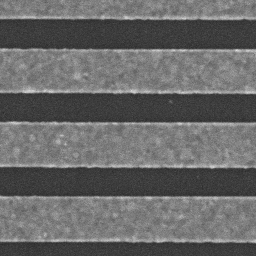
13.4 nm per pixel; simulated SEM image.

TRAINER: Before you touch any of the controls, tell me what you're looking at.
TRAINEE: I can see lines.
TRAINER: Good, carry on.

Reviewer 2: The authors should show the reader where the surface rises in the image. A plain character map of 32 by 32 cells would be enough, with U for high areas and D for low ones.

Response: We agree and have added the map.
UUUUUUUUUUUUUUUUUUUUUUUUUUUUUUUU
UUUUUUUUUUUUUUUUUUUUUUUUUUUUUUUU
DDDDDDDDDDDDDDDDDDDDDDDDDDDDDDDD
DDDDDDDDDDDDDDDDDDDDDDDDDDDDDDDD
DDDDDDDDDDDDDDDDDDDDDDDDDDDDDDDD
DDDDDDDDDDDDDDDDDDDDDDDDDDDDDDDD
UUUUUUUUUUUUUUUUUUUUUUUUUUUUUUUU
UUUUUUUUUUUUUUUUUUUUUUUUUUUUUUUU
UUUUUUUUUUUUUUUUUUUUUUUUUUUUUUUU
UUUUUUUUUUUUUUUUUUUUUUUUUUUUUUUU
UUUUUUUUUUUUUUUUUUUUUUUUUUUUUUUU
UUUUUUUUUUUUUUUUUUUUUUUUUUUUUUUU
DDDDDDDDDDDDDDDDDDDDDDDDDDDDDDDD
DDDDDDDDDDDDDDDDDDDDDDDDDDDDDDDD
DDDDDDDDDDDDDDDDDDDDDDDDDDDDDDDD
UUUUUUUUUUUUUUUUUUUUUUUUUUUUUUUU
UUUUUUUUUUUUUUUUUUUUUUUUUUUUUUUU
UUUUUUUUUUUUUUUUUUUUUUUUUUUUUUUU
UUUUUUUUUUUUUUUUUUUUUUUUUUUUUUUU
UUUUUUUUUUUUUUUUUUUUUUUUUUUUUUUU
UUUUUUUUUUUUUUUUUUUUUUUUUUUUUUUU
DDDDDDDDDDDDDDDDDDDDDDDDDDDDDDDD
DDDDDDDDDDDDDDDDDDDDDDDDDDDDDDDD
DDDDDDDDDDDDDDDDDDDDDDDDDDDDDDDD
DDDDDDDDDDDDDDDDDDDDDDDDDDDDDDDD
UUUUUUUUUUUUUUUUUUUUUUUUUUUUUUUU
UUUUUUUUUUUUUUUUUUUUUUUUUUUUUUUU
UUUUUUUUUUUUUUUUUUUUUUUUUUUUUUUU
UUUUUUUUUUUUUUUUUUUUUUUUUUUUUUUU
UUUUUUUUUUUUUUUUUUUUUUUUUUUUUUUU
DDDDDDDDDDDDDDDDDDDDDDDDDDDDDDDD
DDDDDDDDDDDDDDDDDDDDDDDDDDDDDDDD